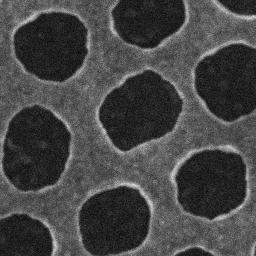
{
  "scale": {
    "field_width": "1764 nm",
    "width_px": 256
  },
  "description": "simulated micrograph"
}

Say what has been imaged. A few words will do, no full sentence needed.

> holes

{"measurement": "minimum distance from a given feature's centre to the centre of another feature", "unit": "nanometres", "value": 711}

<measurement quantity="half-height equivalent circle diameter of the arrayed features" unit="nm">517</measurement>